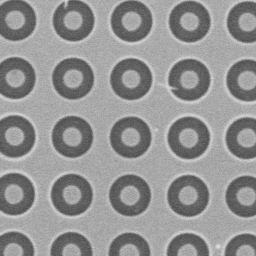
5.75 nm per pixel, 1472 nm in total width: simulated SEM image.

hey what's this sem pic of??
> an array of small figures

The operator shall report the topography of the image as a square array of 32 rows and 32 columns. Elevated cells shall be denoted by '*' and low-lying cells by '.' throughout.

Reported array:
....***....****...****...****...
....***.....**.....**.....***...
.....*......**.....**.....**....
....***.....**.....**.....**....
....***....***....****....***...
********************************
********************************
...*****..*****...****...*****..
....***....***.....**.....***...
.....*......**.....**.....**....
....***.....**.....**.....**....
....***....***.....**.....***...
****************.*****...*****..
********************************
*..*****..*************.********
....***....***....***.....***...
....**......**.....**.....**....
.....*......**.....**.....**....
....***....***.....**.....**....
...*****..*****...****...****...
********************************
*.******************************
....***....***....****...****...
....**.....***..*..**.....**....
....**......**.**..**.....**....
....**.....***..*..**.....**....
...****....****...****...****...
********************************
********************************
...****....****...****...****...
....**.....***.....**.....**....
....**......**.....**.....**....